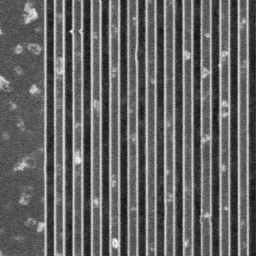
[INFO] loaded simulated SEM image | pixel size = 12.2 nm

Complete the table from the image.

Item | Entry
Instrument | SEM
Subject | parallel lines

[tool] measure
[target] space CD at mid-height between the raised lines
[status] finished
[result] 107 nm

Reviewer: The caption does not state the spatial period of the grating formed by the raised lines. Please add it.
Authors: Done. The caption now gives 224 nm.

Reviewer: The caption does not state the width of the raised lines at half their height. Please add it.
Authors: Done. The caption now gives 9.5 pixels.